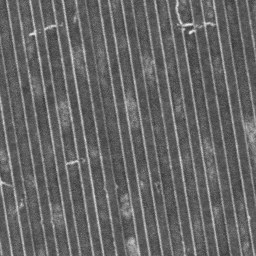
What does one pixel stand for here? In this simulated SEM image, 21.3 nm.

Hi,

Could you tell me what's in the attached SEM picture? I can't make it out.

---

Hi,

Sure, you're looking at parallel lines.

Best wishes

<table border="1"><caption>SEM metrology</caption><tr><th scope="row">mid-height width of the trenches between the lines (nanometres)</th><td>254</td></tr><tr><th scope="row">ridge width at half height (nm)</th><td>215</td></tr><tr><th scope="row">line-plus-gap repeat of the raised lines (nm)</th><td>482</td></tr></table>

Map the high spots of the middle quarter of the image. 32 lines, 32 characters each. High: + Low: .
++....++...+++...+++...++....++.
++....++....++...+++...+++...++.
+++...++....++...+++...+++...++.
+++...+++...++...+++...+++...+++
+++...+++...++....++...+++...+++
.++...+++...+++...++....++...+++
.++....++...+++...+++...++...+++
.++....++....++...+++...+++...++
.+++...++....++...+++...+++...++
.+++...++....++...+++...+++...++
.+++...+++...++....++...+++...++
..++...+++...+++...++....++...++
..++....++...+++...+++...++...++
..++....++...+++...+++...++....+
..++....++....++...+++...+++...+
..+++...++....++...+++...+++...+
..+++...+++...++....++...+++...+
...++...+++...+++...++...+++...+
...++...+++...+++...++....++...+
...++....++...+++...+++...++....
...++....++....++...+++...+++...
...+++...++....++...+++...+++...
...+++...+++...++...+++...+++...
....++...+++...+++...++...+++...
...+++...+++...+++...++....++...
+...++....++...+++...+++...++...
+...++....++....++...+++...+++..
+...+++...++....++....++...+++..
+...+++...+++...++....++...+++..
+...+++...+++...++....++...+++..
+....++...+++...+++...++....++..
+....++...+++...+++...+++...++..